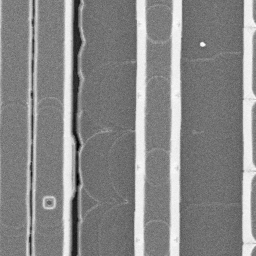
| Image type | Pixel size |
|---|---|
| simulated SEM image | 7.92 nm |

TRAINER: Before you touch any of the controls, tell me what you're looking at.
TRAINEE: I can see wiring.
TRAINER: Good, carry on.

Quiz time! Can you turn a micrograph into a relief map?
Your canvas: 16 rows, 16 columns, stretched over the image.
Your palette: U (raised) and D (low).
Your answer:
UUUUDDDDDUUDDDDD
UUUUDDDDDUUDDDDD
UUUUDDDDDUUDDDDD
UUUUDDDDDUUDDDDD
UUUUDDDDDUUDDDDD
UUUUDDDDDUUDDDDD
UUUUDDDDDUUDDDDU
UUUUDDDDDUUDDDDU
UUUUDDDDDUUDDDDU
UUUUDDDDDUUDDDDD
UUUUDDDDDUUDDDDD
UUUUDDDDDUUDDDDU
UUUUDDDDDUUDDDDU
UUUUDDDDDUUDDDDU
UUUUDDDDDUUDDDDU
UUUUDDDDDUUDDDDU